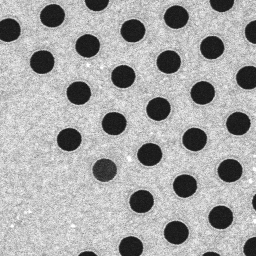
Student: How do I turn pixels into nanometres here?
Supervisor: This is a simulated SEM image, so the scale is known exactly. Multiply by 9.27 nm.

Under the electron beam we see a regular array of holes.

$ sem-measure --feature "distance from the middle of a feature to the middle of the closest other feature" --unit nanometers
430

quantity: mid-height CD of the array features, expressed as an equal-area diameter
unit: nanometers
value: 226